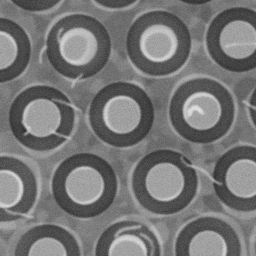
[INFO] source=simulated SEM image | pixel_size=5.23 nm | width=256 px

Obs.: an array of small figures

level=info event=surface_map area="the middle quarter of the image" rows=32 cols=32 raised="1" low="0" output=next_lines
00000000001111111000000000000011
00000000011111111100000000000111
00000000111111111111000000011111
00000011111111111111111111111110
11111111111111000111111111111000
11111111110000000001111111110000
11111111100000000000111111110000
11111111000000000000011111100000
01111110000001110000001111100000
00111110000011111100001111000001
00111100000111111110001111000011
00011100000111111110000111000011
00011100000111111110000111000011
00011100000111111110001111000011
00011100000111111110001111000001
00011100000111111100001111100000
00011110000011111000001111110000
00111111000000000000011111110000
01111111100000000000111111111100
11111111110000000001111111111111
11111111111100000111111111111111
11111111111111111111111100011111
11100000111111111111100000000011
10000000011111111111000000000001
00000000000111111100000000000000
00000000000011111100000111110000
00011111000011111000001111111000
01111111100001111000011111111000
01111111100001110000011111111100
01111111110000110000011111111100
01111111110000110000011111111100
01111111110001111000011111111000